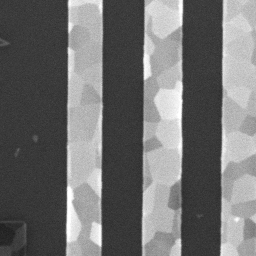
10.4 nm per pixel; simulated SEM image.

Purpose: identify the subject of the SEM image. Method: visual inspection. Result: wiring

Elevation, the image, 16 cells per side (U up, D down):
DDDDUUDDDUUDDDUU
DDDDUUDDDUUDDDUU
DDDDUUDDDUUDDDUU
DDDDUUDDDUUDDDUU
DDDDUUDDDUUDDDUU
DDDDUUDDDUUDDDUU
DDDDUUDDDUUDDDUU
DDDDUUDDDUUDDDUU
DDDDUUDDDUUDDDUU
DDDDUUDDDUUDDDUU
DDDDUUDDDUUDDDUU
DDDDUUDDDUUDDDUU
DDDDUUDDDUUDDDUU
DDDDUUDDDUUDDDUU
UUDDUUDDDUUDDDUU
UUDDUUDDDUUDDDUU